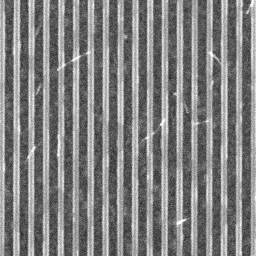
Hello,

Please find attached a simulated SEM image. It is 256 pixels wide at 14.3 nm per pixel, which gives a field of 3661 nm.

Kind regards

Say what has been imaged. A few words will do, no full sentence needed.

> parallel lines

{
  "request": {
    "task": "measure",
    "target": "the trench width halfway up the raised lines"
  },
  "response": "9.63 px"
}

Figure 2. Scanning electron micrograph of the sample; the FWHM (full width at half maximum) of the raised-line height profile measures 75.1 nanometers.